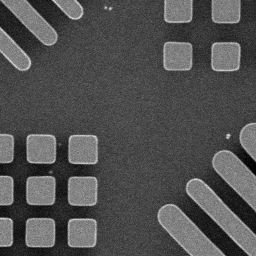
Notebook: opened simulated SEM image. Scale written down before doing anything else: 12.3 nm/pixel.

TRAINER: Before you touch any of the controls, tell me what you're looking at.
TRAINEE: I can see groups of lines, slits or small figures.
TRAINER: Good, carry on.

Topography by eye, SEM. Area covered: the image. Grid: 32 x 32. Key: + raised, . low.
.+++...+++...........+++...+++..
..+++...++...........+++...+++..
..++++...............+++...+++..
...++++.........................
+...+++.........................
++....+..............+++...+++..
+++..................+++...+++..
.+++.................+++...+++..
..+..................+++...+++..
................................
................................
................................
................................
................................
................................
...............................+
..............................++
++.++++..+++..................++
++.++++..+++...................+
++.++++..+++...............++..+
...........................+++..
...........................++++.
+...+++..+++............+...++++
++.++++..+++...........+++...+++
++.++++..+++............+++...++
+...++...+++.............+++...+
....................+++...+++...
+...++...+++........++++...+++..
+..++++..+++.........++++...+++.
+..++++..+++.........+++++...+++
+..++++..+++..........+++++...++
.......................+++++...+